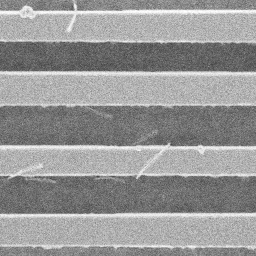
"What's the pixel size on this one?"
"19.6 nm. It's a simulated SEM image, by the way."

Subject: lines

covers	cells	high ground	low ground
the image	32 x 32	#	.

................................
################################
################################
################################
################################
................................
................................
................................
................................
################################
################################
################################
################################
................................
................................
................................
................................
................................
################################
################################
################################
################################
................................
................................
................................
................................
................................
################################
################################
################################
################################
................................